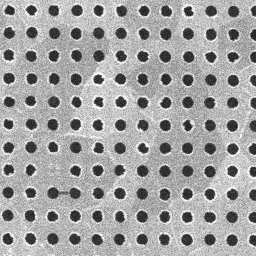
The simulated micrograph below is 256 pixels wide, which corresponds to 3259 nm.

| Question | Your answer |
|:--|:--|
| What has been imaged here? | a regular array of holes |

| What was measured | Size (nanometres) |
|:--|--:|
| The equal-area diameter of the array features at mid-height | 148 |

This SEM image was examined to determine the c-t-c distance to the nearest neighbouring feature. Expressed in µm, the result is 0.282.